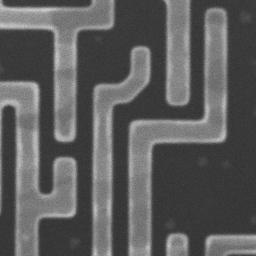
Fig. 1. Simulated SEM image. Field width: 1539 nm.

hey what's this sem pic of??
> wiring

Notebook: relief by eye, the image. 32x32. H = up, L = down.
LLLLLLLLLLLHHHLLLLLLLHHHLLLLLLLL
HHHHHHHHHHHHHHLLLLLLLHHHLLHHLLLL
HHHHHHHHHHHHHHLLLLLLLHHHLLHHLLLL
LLLLLHHHHHHHHHLLLLLLLHHHLLHHLLLL
LLLLLLLHHHLLLLLLLLLLLHHHLLHHLLLL
LLLLLLLHHLLLLLLLLLLLLHHHLLHHLLLL
LLLLLLLHHLLLLLLLLHHLLHHHLLHHLLLL
LLLLLLLHHLLLLLLLLHHLLHHHLLHHLLLL
LLLLLLLHHLLLLLLLHHHLLHHHLLHHLLLL
LLLLLLLHHLLLLLLLHHHLLHHHLLHHLLLL
HHHHLLLHHLLLLLLHHHLLLHHHLLHHLLLL
HHHHHLLHHLLLHHHHHLLLLHHHLLHHLLLL
HHHHHLLHHLLLHHHHLLLLLHHHLLHHLLLL
LLHHHLLHHLLLHHLLLLLLLLLLLLHLLLLL
LLHHHLLHHLLLHHLLLLLLLLLLLLHHLLLL
LLHHHLLHHLLLHHLLHHHHHHHHHHHHLLLL
LLHHHLLHHLLLHHLLHHHHHHHHHHHHLLLL
LLHHHLLHHLLLHHLLHHHHHHHHHHHHLLLL
LLHHHLLLLLLLHHLLHHHLLLLLLLLLLLLL
LLHHHLLLLLLLHHLLHHHLLLLLLLLLLLLL
LLHHHLLHHLLLHHLLHHHLLLLLLLLLLLLL
LLHHHLLHHLLLHHLLHHHLLLLLLLLLLLLL
LLHHHLLHHLLLHHLLHHHLLLLLLLLLLLLL
LLHHHLLHHLLLHHLLHHHLLLLLLLLLLLLL
LLHHHHHHHLLLHHLLHHHLLLLLLLLLLLLL
LLHHHHHHHLLLHHLLHHHLLLLLLLLLLLLL
LLHHHHHHHLLLLLLLHHHLLLLLLLLLLLLL
LLHHHLLLLLLLHHLLHHHLLLLLLLLLLLLL
LLHHHLLLLLLLHHLLHHHLLLLLLLLLLLLL
LLHHHLLLLLLLHHLLHHHLLHHLLLLLLLLL
LLHHHLLLLLLLHHLLHHHLLLLLLLHHHHLL
LLHHHLLLLLLLHHLLHHHLLHHLLLHHHHHL